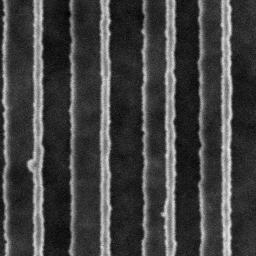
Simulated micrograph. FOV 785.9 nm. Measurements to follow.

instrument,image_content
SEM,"lines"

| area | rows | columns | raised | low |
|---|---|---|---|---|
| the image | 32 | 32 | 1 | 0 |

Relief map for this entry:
01111000011111000011110001111000
01111000011111000011110001111000
01111000011111000011110001111000
01111000011111000011110001111000
11111000011111000011110001111000
11111000011111000011110001111000
11111000011111000011110001111000
11111000011111000011110001111000
11111000011111000011110001111000
11111000011111000011110001111000
01111000011111000011110001111000
11111000011111000011110001111000
11111000011111000011110001111000
01111000011111000011110001111000
01111000011111000011110001111000
01111000011111000011110001111000
01111000011111000011110001111000
01111000011111000011110001111000
01111000011111000011110001111000
01111000011111000011110001111000
01111000011111000011110001111000
01111000011111000011110001111000
11111000011111000011110001111000
11111000011111000011110001111000
01111000011111000011110001111000
01111000011111000011110001111000
01111000011111000011110001111000
01111000011111000011110001111000
01111000011111000011110001111000
01111000011111000011110001111000
01111000011111000011110001111000
01111000011111000011110001111000